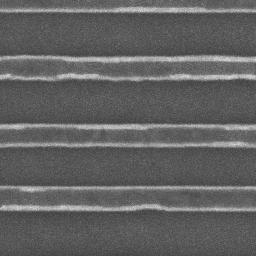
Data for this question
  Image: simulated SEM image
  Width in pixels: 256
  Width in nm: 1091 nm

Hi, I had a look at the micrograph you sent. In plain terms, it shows one or a few lines or trenches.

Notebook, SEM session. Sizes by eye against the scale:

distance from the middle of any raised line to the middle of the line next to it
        278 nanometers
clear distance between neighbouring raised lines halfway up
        0.194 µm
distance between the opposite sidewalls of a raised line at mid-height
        21.5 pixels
